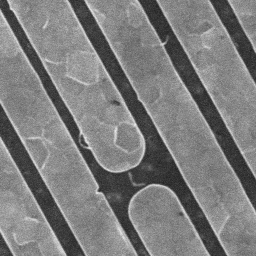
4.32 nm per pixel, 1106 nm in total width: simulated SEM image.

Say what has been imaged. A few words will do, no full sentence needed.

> one or a few lines or trenches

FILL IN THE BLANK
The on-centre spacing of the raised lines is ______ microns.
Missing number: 0.271